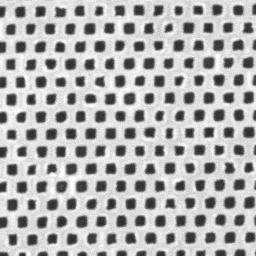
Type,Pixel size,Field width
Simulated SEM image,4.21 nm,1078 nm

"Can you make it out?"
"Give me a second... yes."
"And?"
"a regular array of holes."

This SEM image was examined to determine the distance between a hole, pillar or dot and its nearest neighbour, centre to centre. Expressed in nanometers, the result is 81.5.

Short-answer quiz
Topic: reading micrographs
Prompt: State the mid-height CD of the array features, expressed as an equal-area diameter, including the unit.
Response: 50.5 nanometers